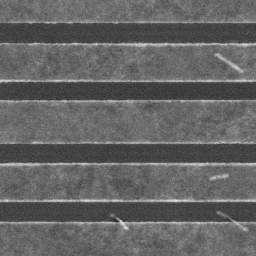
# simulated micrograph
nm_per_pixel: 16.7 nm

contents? lines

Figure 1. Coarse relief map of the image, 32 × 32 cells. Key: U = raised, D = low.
UUUUUUUUUUUUUUUUUUUUUUUUUUUUUUUU
UUUUUUUUUUUUUUUUUUUUUUUUUUUUUUUU
UUUUUUUUUUUUUUUUUUUUUUUUUUUUUUUU
DDDDDDDDDDDDDDDDDDDDDDDDDDDDDDDD
DDDDDDDDDDDDDDDDDDDDDDDDDDDDDDDD
UDDDUUDDDUUDUUDDDDDDDDDDDDUUDDDD
UUUUUUUUUUUUUUUUUUUUUUUUUUUUUUUU
UUUUUUUUUUUUUUUUUUUUUUUUUUUUUUUU
UUUUUUUUUUUUUUUUUUUUUUUUUUUUUUUU
UUUUUUUUUUUUUUUUUUUUUUUUUUUUUUUU
DDDDDDDDDDDDDDDDDDDDDDDDDDDDDDDD
DDDDDDDDDDDDDDDDDDDDDDDDDDDDDDDD
DDDDDDDDDDDDDDDDDDDDDDDDDDDDDDDD
UUUUUUUUUUUUUUUUUUUUUUUUUUUUUUUU
UUUUUUUUUUUUUUUUUUUUUUUUUUUUUUUU
UUUUUUUUUUUUUUUUUUUUUUUUUUUUUUUU
UUUUUUUUUUUUUUUUUUUUUUUUUUUUUUUU
UUUUUUUUUUUUUUUUUUUUUUUUUUUUUUUU
DDDDDDDDDDDDDDDDDDDDDDDDDDDDDDDD
DDDDDDDDDDDDDDDDDDDDDDDDDDDDDDDD
DUUDUUDUUUUUUUUUUUUUUUUDUUDUUUUU
UUUUUUUUUUUUUUUUUUUUUUUUUUUUUUUU
UUUUUUUUUUUUUUUUUUUUUUUUUUUUUUUU
UUUUUUUUUUUUUUUUUUUUUUUUUUUUUUUU
UUUUUUUUUUUUUUUUUUUUUUUUUUUUUUUU
DDDDDDDDDDDDDDDDDDDDDDDDDDDDDDDD
DDDDDDDDDDDDDDDDDDDDDDDDDDDDDDDD
DDDDDDDDDDDDDDDDDDDDDDDDDDDDDDDD
UUUUUUUUUUUUUUUUUUUUUUUUUUUUUUUU
UUUUUUUUUUUUUUUUUUUUUUUUUUUUUUUU
UUUUUUUUUUUUUUUUUUUUUUUUUUUUUUUU
UUUUUUUUUUUUUUUUUUUUUUUUUUUUUUUU